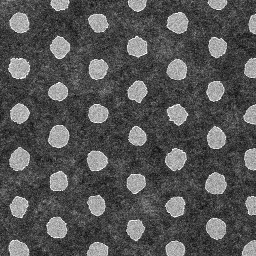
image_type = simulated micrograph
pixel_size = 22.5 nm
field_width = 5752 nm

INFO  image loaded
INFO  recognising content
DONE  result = a regular array of raised bodies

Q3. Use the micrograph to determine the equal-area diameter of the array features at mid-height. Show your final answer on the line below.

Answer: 437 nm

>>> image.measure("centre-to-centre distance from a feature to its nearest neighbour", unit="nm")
999